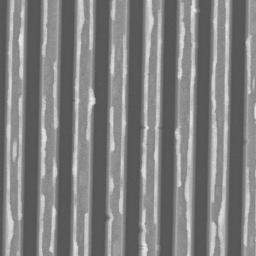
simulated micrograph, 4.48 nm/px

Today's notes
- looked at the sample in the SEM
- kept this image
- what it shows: parallel lines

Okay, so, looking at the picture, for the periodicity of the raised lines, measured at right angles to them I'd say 153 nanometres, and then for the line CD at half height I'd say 17.5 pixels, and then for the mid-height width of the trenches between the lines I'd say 76.4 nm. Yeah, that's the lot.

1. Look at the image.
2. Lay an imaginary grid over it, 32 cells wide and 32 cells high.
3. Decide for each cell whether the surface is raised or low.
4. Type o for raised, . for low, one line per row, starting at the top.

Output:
.oo..oo...oo..oo..oo..ooo..oo..o
.oo..oo...oo..oo..oo..ooo..oo..o
.oo..oo...oo..oo..oo..oo...oo..o
.oo..oo...oo..oo..oo..oo...oo..o
.oo..oo...oo..oo..oo..oo...oo..o
.oo..oo...oo..oo..oo..ooo..oo..o
.oo..oo...oo..oo..oo..oo...oo..o
.oo..oo...o...oo..oo..oo...oo..o
.oo..oo...o...oo..oo..oo...oo..o
.oo..oo..oo...oo..oo..oo...oo..o
.oo..oo..oo...oo..oo..oo...oo..o
.oo..oo..ooo..oo..oo..oo..ooo..o
.oo..oo..ooo..oo..oo..oo..ooo..o
.oo..oo..oo...oo..oo..oo..ooo..o
.oo..oo..oo...oo..oo..oo..ooo..o
.oo..oo..oo...oo..oo..oo..oo...o
.oo..oo..oo...oo..oo..oo..oo...o
.oo..oo..oo...oo..oo..oo..oo...o
.oo..oo..oo...oo..oo..oo..oo...o
.oo..oo..oo...oo..oo..oo..oo...o
.oo..oo..oo...oo..oo..oo..oo...o
.oo..oo..oo...o...oo..oo..oo...o
.oo..oo..oo...o...oo..oo..oo...o
.oo..oo..oo...o...oo..oo..oo...o
.oo..oo..oo...o...oo..oo..oo...o
.oo..oo..oo...o...oo..oo..oo...o
.oo..oo..oo...o...oo..oo..oo...o
.oo..oo..oo...o...oo..oo..oo...o
.oo..oo..oo...o...oo..oo..oo...o
.oo..oo..oo..oo...oo..oo..oo...o
.oo..oo..oo..oo...oo..oo..oo...o
.oo..oo..oo..oo...oo..oo..oo..oo